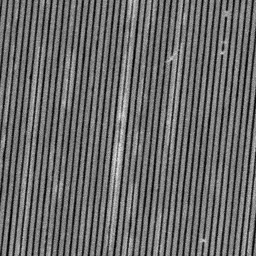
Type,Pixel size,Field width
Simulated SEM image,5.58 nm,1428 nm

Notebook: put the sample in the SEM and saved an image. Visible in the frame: parallel lines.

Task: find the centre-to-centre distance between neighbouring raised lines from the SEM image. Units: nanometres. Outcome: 34.9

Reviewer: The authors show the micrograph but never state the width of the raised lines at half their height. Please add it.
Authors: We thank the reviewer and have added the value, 22.2 nm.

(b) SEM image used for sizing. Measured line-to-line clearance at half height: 11.1 nanometres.